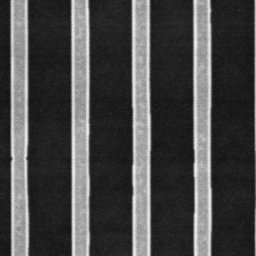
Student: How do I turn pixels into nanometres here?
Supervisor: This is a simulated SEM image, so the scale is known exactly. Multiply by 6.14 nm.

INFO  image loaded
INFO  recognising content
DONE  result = one or a few lines or trenches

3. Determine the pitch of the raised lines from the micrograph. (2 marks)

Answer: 374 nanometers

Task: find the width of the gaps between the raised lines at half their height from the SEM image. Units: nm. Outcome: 286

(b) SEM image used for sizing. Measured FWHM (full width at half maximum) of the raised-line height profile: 85.9 nm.